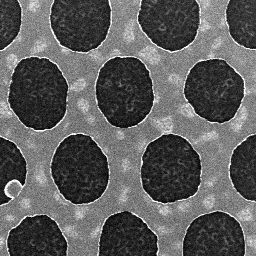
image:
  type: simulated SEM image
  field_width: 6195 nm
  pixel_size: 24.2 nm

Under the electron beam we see holes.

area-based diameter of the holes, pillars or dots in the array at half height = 1580 nanometers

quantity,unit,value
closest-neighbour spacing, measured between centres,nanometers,2100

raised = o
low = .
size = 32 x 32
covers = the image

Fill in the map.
..ooooo.......oooo.......ooo....
...ooo........ooo........ooo....
...ooo........ooo........ooo....
...ooo........oooo.......oooo...
..ooooo......ooooo.......oooo...
.oooooo......oooooo.....oooooo..
ooooooooo..ooooooooooooooooooooo
ooo...oooooooo...ooooooooo..oooo
oo.....oooooo.....oooooo.....ooo
oo......oooo.......oooo.......oo
o.......oooo.......oooo........o
o.......oooo.......oooo........o
o.......oooo.......oooo.......oo
o.......oooo.......ooooo......oo
oo......ooooo.....ooooooo....ooo
ooo....ooooooo...ooooooooooooooo
oooooooooooooooooooooooooooooooo
.ooooooo....ooooooo....oooooooo.
..ooooo......ooooo......ooooo...
...oooo......ooooo.......oooo...
...ooo........oooo.......oooo...
...ooo........oooo.......oooo...
...oooo.......oooo.......oooo...
.oooooo......ooooo.......oooo...
.ooooooo.....oooooo.....oooooo..
.oooooooo.oooooooooooooooooooooo
ooooooooooooooo.ooooooooooo.oooo
ooo....oooooo.....oooooo......oo
oo.....oooooo......oooo.......oo
o.......ooooo.......ooo........o
o.......oooo........ooo........o
o.......oooo........ooo........o